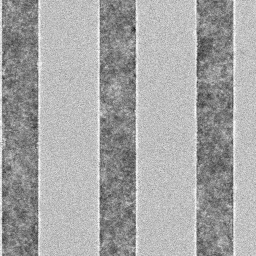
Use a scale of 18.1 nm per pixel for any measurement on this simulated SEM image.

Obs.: one or a few lines or trenches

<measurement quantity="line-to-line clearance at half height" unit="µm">0.674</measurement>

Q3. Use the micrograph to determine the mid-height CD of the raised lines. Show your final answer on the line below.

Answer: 1090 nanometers